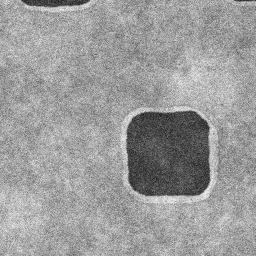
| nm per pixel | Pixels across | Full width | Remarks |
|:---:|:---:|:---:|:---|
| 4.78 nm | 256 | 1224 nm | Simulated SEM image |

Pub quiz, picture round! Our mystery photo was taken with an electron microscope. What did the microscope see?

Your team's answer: holes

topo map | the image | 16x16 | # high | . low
################
################
################
################
################
################
################
########.....###
########.....###
########.....###
########.....###
########.....###
################
################
################
################